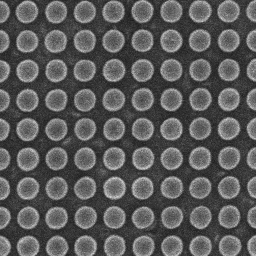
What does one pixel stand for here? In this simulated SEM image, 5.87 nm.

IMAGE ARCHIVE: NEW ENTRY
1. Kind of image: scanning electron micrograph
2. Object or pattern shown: a regular array of raised bodies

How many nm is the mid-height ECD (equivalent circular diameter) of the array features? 125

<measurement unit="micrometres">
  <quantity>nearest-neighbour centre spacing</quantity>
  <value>0.168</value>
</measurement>